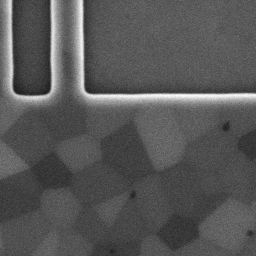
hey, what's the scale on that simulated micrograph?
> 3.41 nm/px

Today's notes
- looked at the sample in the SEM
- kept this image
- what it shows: wiring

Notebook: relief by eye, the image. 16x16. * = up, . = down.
*..**...........
*..**...........
*..**...........
*..**...........
*..**...........
*..**...........
****************
****************
****************
****************
****************
****************
****************
****************
****************
****************